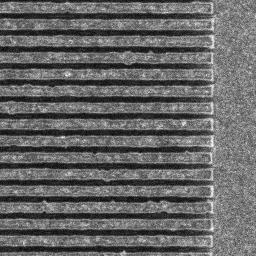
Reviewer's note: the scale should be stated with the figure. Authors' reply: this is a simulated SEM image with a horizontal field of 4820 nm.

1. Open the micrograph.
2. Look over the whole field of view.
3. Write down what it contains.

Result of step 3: parallel lines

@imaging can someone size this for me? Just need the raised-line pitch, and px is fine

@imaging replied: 16.6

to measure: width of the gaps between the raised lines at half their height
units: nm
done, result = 106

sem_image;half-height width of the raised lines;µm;0.195